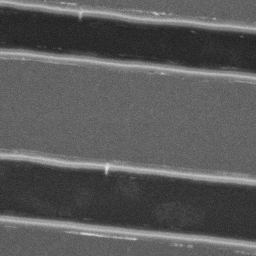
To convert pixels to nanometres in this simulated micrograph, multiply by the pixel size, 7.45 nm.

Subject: one or a few lines or trenches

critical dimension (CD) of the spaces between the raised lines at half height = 0.396 micrometres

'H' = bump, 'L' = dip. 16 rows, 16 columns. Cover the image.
LLHHHHHHHHHHHHHH
LLLLLLLLLLLLHHHH
LLLLLLLLLLLLLLLL
HHHHLLLLLLLLLLLL
HHHHHHHHHHHHHLLL
HHHHHHHHHHHHHHHH
HHHHHHHHHHHHHHHH
HHHHHHHHHHHHHHHH
HHHHHHHHHHHHHHHH
HHHHHHHHHHHHHHHH
LLLLLLLHHHHHHHHH
LLLLLLLLLLLLLLLL
LLLLLLLLLLLLLLLL
LLLLLLLLLLLLLLLL
HHHHHHHHLLLLLLLL
HHHHHHHHHHHHHHHH